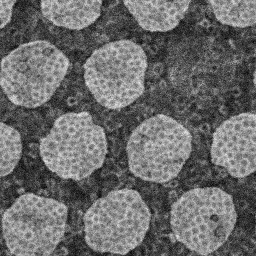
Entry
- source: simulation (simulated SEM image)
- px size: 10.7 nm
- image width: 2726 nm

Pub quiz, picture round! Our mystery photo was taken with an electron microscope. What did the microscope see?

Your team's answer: raised bodies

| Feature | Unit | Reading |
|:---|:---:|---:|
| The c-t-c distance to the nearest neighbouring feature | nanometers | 900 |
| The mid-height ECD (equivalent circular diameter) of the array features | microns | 0.653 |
